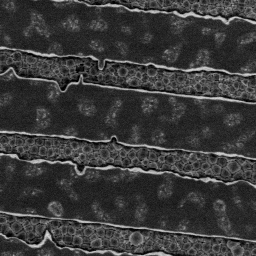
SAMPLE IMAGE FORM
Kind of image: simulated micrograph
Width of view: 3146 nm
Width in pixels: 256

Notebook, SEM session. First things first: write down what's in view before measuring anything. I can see one or a few lines or trenches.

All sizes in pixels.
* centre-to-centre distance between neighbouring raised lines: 81